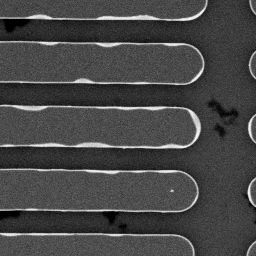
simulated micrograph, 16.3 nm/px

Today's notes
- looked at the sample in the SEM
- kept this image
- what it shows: groups of lines, slits or small figures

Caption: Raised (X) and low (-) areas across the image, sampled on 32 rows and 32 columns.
XXXXXXXXXXXXXXXXXXXXXXXXXX-----X
XXXXXXXXXXXXXXXXXXXXXXXXX-------
--------------------------------
--------------------------------
--------------------------------
XXXXXXXXXXXX---XX-XXX-----------
XXXXXXXXXXXXXXXXXXXXXXXXX-------
XXXXXXXXXXXXXXXXXXXXXXXXX------X
XXXXXXXXXXXXXXXXXXXXXXXXX------X
XXXXXXXXXXXXXXXXXXXXXXXXX-------
--------------------------------
--------------------------------
--------------------------------
XXX--XXXXXXXXXX--X--XXX---------
XXXXXXXXXXXXXXXXXXXXXXXX--------
XXXXXXXXXXXXXXXXXXXXXXXXX------X
XXXXXXXXXXXXXXXXXXXXXXXXX------X
XXXXXXXXXXXXXXXXXXXXXXXX--------
--------------------------------
--------------------------------
--------------------------------
XXXXXXXXXXXXXXXXXXXXXXX---------
XXXXXXXXXXXXXXXXXXXXXXXX--------
XXXXXXXXXXXXXXXXXXXXXXXXX------X
XXXXXXXXXXXXXXXXXXXXXXXXX------X
XXXXXXXXXXXXXXXXXXXXXXXX--------
--------------------------------
--------------------------------
--------------------------------
XXXXXXXXXXXXXXXXXXXXXX----------
XXXXXXXXXXXXXXXXXXXXXXXX--------
XXXXXXXXXXXXXXXXXXXXXXXX-------X